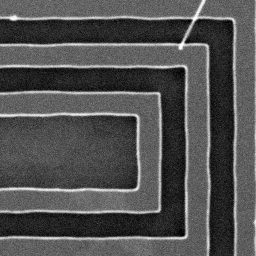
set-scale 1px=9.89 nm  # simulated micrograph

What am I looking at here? groups of lines, slits or small figures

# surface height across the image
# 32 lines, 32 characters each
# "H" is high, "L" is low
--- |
HHHHHHHHHHHHHHHHHHHHHHHHHHHHHHHH
HHHHHHHHHHHHHHHHHHHHHHHHHHHHHHHH
LLLLLLLLLLLLLLLLLLLLLLLLLLLLLHHH
LLLLLLLLLLLLLLLLLLLLLLLLLLLLLHHH
LLLLLLLLLLLLLLLLLLLLLLLLLLLLLHHH
LLLLLLLLLLLLLLLLLLLLLLHLLLLLLHHH
HHHHHHHHHHHHHHHHHHHHHHHHHHLLLHHH
HHHHHHHHHHHHHHHHHHHHHHHHHHLLLHHH
LLLLLLLLLLLLLLLLLLLLLLLHHHLLLHHH
LLLLLLLLLLLLLLLLLLLLLLLHHHLLLHHH
LLLLLLLLLLLLLLLLLLLLLLLHHHLLLHHH
LLLHHHHHLLLLLLLLLLLLLLLHHHLLLHHH
HHHHHHHHHHHHHHHHHHHHLLLHHHLLLHHH
HHHHHHHHHHHHHHHHHHHHLLLHHHLLLHHH
LLLLLLLLLLLLLLLLLHHHLLLHHHLLLHHH
LLLLLLLLLLLLLLLLLHHHLLLHHHLLLHHH
LLLLLLLLLLLLLLLLLHHHLLLHHHLLLHHH
LLLLLLLLLLLLLLLLLHHHLLLHHHLLLHHH
LLLLLLLLLLLLLLLLLHHHLLLHHHLLLHHH
LLLLLLLLLLLLLLLLLHHHLLLHHHLLLHHH
LLLLLLLLLLLLLLLLLHHHLLLHHHLLLHHH
LLLLLLLLLLLLLLLLLHHHLLLHHHLLLHHH
LLLLLLLLLLLLLLLLLHHHLLLHHHLLLHHH
LLLLLLLLLLLLLLLLLHHHLLLHHHLLLHHH
HHHHHHHHHHHHHHHHHHHHLLLHHHLLLHHH
HHHHHHHHHHHHHHHHHHHHLLLHHHLLLHHH
LHHLLLLLLHHHHLLLHHHLLLLHHHLLLHHH
LLLLLLLLLLLLLLLLLLLLLLLHHHLLLHHH
LLLLLLLLLLLLLLLLLLLLLLLHHHLLLHHH
LLLLLLLLLLLLLLLLLLLLLLLHHHLLLHHH
HHHHHHHHHHHHHHHHHHHHHHHHHHLLLHHH
HHHHHHHHHHHHHHHHHHHHHHHHHHLLLHHH